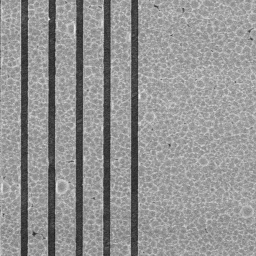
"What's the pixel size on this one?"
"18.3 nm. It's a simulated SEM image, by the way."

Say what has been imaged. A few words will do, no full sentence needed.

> parallel lines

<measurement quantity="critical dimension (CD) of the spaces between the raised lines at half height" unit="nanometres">142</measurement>